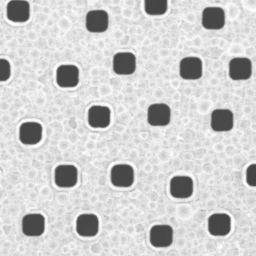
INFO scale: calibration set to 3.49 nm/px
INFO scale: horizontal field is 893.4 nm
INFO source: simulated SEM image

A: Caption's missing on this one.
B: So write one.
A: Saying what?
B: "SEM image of a regular array of holes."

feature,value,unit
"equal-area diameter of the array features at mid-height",84.1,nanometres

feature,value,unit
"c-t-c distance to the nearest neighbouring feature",187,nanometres